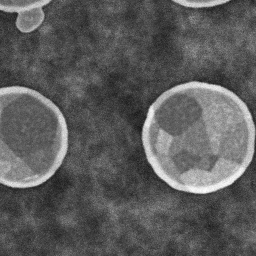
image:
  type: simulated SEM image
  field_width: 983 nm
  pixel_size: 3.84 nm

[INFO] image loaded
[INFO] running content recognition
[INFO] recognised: raised bodies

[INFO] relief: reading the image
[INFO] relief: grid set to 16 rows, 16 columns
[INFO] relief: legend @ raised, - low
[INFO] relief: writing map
@@--------------
----------------
----------------
----------------
----------------
-----------@@@--
@@@-------@@@@@-
@@@@-----@@@@@@@
@@@@-----@@@@@@@
@@@@-----@@@@@@@
@@@-------@@@@@-
-@---------@@@--
----------------
----------------
----------------
----------------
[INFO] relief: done